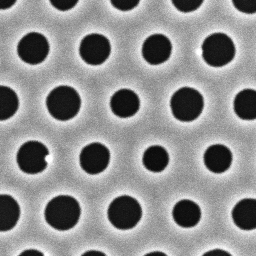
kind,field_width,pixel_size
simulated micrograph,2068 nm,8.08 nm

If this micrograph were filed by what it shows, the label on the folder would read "a regular array of holes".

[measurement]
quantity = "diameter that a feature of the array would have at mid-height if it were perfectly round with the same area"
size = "264 nm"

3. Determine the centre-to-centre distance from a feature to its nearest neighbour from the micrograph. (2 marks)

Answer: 499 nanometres